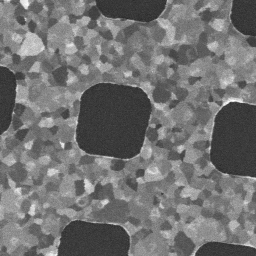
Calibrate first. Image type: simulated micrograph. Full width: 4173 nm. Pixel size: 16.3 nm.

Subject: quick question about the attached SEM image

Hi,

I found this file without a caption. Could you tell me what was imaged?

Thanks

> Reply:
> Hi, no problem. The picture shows holes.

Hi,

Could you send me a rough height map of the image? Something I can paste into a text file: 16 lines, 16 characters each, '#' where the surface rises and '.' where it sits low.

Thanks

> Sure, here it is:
######....####..
###############.
################
################
.###############
.#####...#######
.####....#####..
.####....####...
#####....####...
#####....####...
##############..
################
################
################
####....########
####....####....